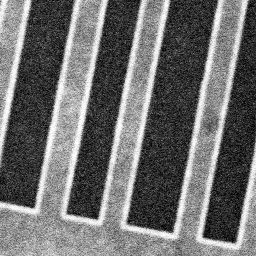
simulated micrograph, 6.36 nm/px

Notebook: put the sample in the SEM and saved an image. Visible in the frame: one or a few lines or trenches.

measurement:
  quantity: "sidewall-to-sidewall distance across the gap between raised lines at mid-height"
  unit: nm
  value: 300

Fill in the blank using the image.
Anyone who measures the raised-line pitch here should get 447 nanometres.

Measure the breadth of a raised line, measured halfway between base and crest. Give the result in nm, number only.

158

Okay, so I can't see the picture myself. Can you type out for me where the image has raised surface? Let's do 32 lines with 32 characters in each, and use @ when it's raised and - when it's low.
@@@@------@@@-----@@@------@@@@-
@@@------@@@@-----@@@------@@@--
@@@------@@@@----@@@@------@@@--
@@@------@@@@----@@@-------@@@--
@@@------@@@-----@@@-------@@@--
@@@------@@@-----@@@-------@@@--
@@------@@@@-----@@@------@@@---
@@------@@@@----@@@-------@@@---
@@------@@@@----@@@-------@@@---
@@------@@@-----@@@-------@@@---
@@------@@@-----@@@------@@@@---
@------@@@@-----@@@------@@@@---
@------@@@@----@@@-------@@@----
@------@@@@----@@@-------@@@----
@------@@@-----@@@-------@@@----
@------@@@-----@@@-------@@@----
------@@@@-----@@@------@@@@----
------@@@@----@@@@------@@@-----
------@@@@----@@@-------@@@-----
------@@@-----@@@-------@@@-----
------@@@-----@@@-------@@@-----
-----@@@@-----@@@------@@@@-----
-----@@@@----@@@@------@@@-----@
-----@@@@----@@@-------@@@-----@
-----@@@@----@@@-------@@@-----@
-----@@@-----@@@-------@@@-----@
@@@@@@@@-----@@@------@@@@-----@
@@@@@@@@@@@-@@@@------@@@-----@@
@@@@@@@@@@@@@@@@@-----@@@-----@@
@@@@@@@@@@@@@@@@@@@@@@@@@-----@@
@@@@@@@@@@@@@@@@@@@@@@@@@@@@--@@
@@@@@@@@@@@@@@@@@@@@@@@@@@@@@@@@